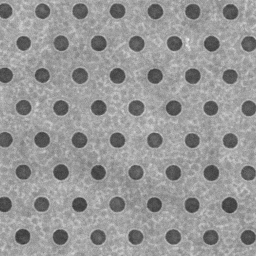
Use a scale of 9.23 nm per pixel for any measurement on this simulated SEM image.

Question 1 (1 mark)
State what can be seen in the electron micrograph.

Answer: a regular array of holes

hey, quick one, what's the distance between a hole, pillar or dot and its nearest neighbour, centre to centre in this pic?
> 342 nanometers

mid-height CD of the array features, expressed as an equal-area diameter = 0.146 um